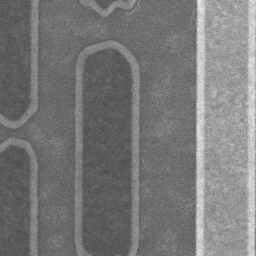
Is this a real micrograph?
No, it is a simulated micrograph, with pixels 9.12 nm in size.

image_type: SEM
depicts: one or a few lines or trenches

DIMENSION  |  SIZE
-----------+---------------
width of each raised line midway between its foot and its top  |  479 nm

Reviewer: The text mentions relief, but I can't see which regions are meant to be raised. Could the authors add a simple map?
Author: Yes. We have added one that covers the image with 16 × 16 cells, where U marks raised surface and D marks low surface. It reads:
UUDDDDUDDDDDDUUU
UUDDDDDDDDDDDUUU
UUDDDDDDDDDDDUUU
UUDDDUUUDDDDDUUU
UUDDDUUUUDDDDUUU
UUDDDUUUUDDDDUUU
UUDDDUUUUDDDDUUU
UDDDDUUUUDDDDUUU
DDDDDUUUDDDDDUUU
UUDDDUUUDDDDDUUU
UUDDDUUUDDDDDUUU
UUDDDUUUDDDDDUUU
UUDDDUUUDDDDDUUU
UUDDDUUUDDDDDUUU
UUDDDUUUDDDDDUUU
UUDDDUUUDDDDDUUU